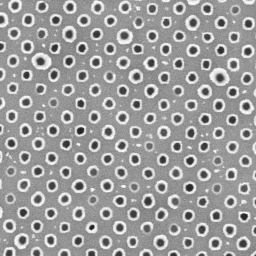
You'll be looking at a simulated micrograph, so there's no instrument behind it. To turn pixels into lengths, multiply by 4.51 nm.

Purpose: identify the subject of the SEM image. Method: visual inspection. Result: a regular array of holes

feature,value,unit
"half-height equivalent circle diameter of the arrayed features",34.9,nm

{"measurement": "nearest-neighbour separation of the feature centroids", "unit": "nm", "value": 85.9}